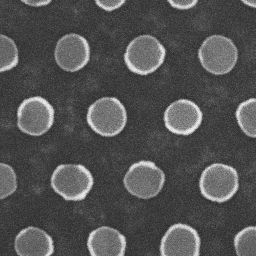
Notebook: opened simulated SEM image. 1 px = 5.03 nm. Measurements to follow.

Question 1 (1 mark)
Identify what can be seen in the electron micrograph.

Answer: a regular array of raised bodies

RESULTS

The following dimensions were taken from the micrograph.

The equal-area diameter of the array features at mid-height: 0.193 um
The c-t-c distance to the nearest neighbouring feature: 362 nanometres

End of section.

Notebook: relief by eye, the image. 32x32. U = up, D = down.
DDDDUUDDDDDDUUUDDDDDDUUUDDDDDDDU
DDDDDDDDDDDDDDDDDDDDDDDDDDDDDDDD
DDDDDDDDDDDDDDDDDDDDDDDDDDDDDDDD
DDDDDDDDDDDDDDDDDDDDDDDDDDDDDDDD
DDDDDDDDUUDDDDDDDDUDDDDDDDDDDDDD
UUDDDDDUUUUDDDDDUUUUDDDDDUUUUDDD
UUDDDDDUUUUDDDDDUUUUUDDDDUUUUUDD
UUDDDDDUUUUDDDDDUUUUDDDDDUUUUUDD
UDDDDDDDUUDDDDDDUUUUDDDDDDUUUDDD
DDDDDDDDDDDDDDDDDDDDDDDDDDDDDDDD
DDDDDDDDDDDDDDDDDDDDDDDDDDDDDDDD
DDDDDDDDDDDDDDDDDDDDDDDDDDDDDDDD
DDDUUUDDDDDDUUUDDDDDDDDDDDDDDDDU
DDUUUUUDDDDUUUUDDDDDDUUUUDDDDDUU
DDUUUUUDDDDUUUUUDDDDDUUUUDDDDDUU
DDUUUUUDDDDUUUUUDDDDDUUUUDDDDDUU
DDDUUUDDDDDDUUUDDDDDDDUUDDDDDDDU
DDDDDDDDDDDDDDDDDDDDDDDDDDDDDDDD
DDDDDDDDDDDDDDDDDDDDDDDDDDDDDDDD
DDDDDDDDDDDDDDDDDDDDDDDDDDDDDDDD
UDDDDDDDDDDDDDDDDUUDDDDDDDDDDDDD
UUDDDDDUUUUDDDDDUUUUDDDDDUUUUUDD
UUDDDDUUUUUUDDDDUUUUDDDDDUUUUUDD
UUDDDDDUUUUDDDDDUUUUDDDDDUUUUUDD
UDDDDDDDUUUDDDDDDUUDDDDDDDUUUDDD
DDDDDDDDDDDDDDDDDDDDDDDDDDDDDDDD
DDDDDDDDDDDDDDDDDDDDDDDDDDDDDDDD
DDDDDDDDDDDDDDDDDDDDDDDDDDDDDDDD
DDDDDDDDDDDDDUDDDDDDDUUUDDDDDDDU
DDUUUUDDDDDUUUUDDDDDDUUUUDDDDUUU
DDUUUUUDDDDUUUUUDDDDUUUUUDDDDUUU
DDUUUUUDDDDUUUUUDDDDUUUUUDDDDDUU